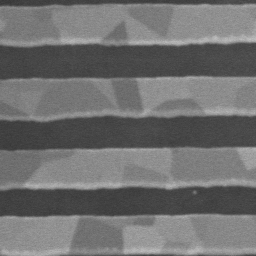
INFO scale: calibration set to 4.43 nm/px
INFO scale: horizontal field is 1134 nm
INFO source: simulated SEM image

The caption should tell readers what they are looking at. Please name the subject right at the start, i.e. lines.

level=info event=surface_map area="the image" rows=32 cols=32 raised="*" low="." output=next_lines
................................
********************************
********************************
********************************
********************************
******.......***..*.***.........
................................
................................
................................
................................
********************************
********************************
********************************
********************************
*************..*******..........
................................
................................
................................
................................
********************************
********************************
********************************
********************************
*************.......**..........
................................
................................
................................
********************************
********************************
********************************
********************************
********************************